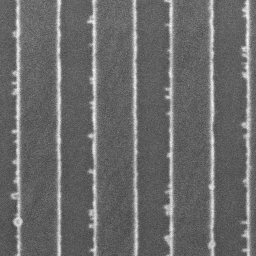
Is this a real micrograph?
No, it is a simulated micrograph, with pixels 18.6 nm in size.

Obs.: lines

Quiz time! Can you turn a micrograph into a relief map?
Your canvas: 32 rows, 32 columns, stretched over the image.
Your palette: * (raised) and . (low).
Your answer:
..*****.....*****....*****.....*
..*****.....*****....*****.....*
..*****.....*****....*****.....*
..*****.....*****....*****.....*
..*****.....*****....*****.....*
..*****.....*****....*****.....*
..*****.....*****....*****.....*
..*****.....*****....*****.....*
..*****.....*****....*****.....*
..*****.....*****....*****.....*
..*****.....*****....******....*
..*****.....*****....*****.....*
..*****.....*****....******....*
..*****.....*****....******....*
..*****.....*****....******....*
..*****.....*****....*****.....*
..*****.....*****....*****.....*
..*****.....*****....******....*
..*****.....*****....******....*
..*****.....*****....******....*
..*****.....*****....******....*
..*****.....*****....******....*
..*****.....*****....******....*
..*****.....*****....******....*
..*****.....*****....******....*
..*****.....*****....*****.....*
..*****.....*****....******....*
..*****.....*****....******....*
..*****.....*****....*****.....*
..*****.....*****....******....*
..*****.....*****....******....*
..*****.....*****....******....*